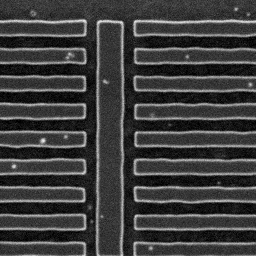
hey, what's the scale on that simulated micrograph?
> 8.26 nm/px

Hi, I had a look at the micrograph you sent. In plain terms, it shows groups of lines, slits or small figures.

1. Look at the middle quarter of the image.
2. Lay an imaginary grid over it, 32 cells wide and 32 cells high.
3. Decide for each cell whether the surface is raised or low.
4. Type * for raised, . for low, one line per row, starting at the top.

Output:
........*******.................
........*******.................
........*******.................
*****...*******...**************
*****...*******...**************
*****...*******...**************
*****...*******...**************
........*******.................
........*******.................
........*******.................
*****...*******...**************
*****...*******...**************
*****...*******...**************
*****...*******...**************
........*******.................
.........******.................
........*******.................
*****...*******...**************
*****...*******...**************
*****...*******...**************
*****...*******...**************
........*******.................
........*******.................
........*******.................
*****...*******...**************
*****...*******...**************
*****...*******...**************
........*******...*****.***.....
........*******.................
........*******.................
........*******.................
*****...*******...**************